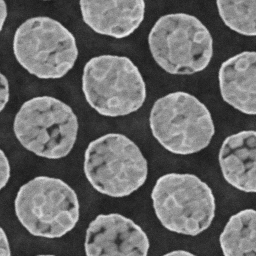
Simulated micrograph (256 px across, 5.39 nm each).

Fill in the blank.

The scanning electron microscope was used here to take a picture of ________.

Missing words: a regular array of raised bodies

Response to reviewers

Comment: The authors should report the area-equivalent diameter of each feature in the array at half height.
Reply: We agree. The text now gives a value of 323 nanometers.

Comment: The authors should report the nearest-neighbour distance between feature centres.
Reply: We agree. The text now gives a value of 421 nanometers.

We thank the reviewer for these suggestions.